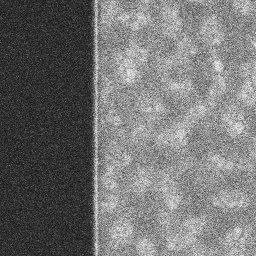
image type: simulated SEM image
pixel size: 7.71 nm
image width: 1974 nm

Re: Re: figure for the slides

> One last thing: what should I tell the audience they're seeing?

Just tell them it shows one or a few lines or trenches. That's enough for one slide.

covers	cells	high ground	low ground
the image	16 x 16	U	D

UUUUUUDDDDDDDDDD
UUUUUUDDDDDDDDDD
UUUUUUDDDDDDDDDD
UUUUUUDDDDDDDDDD
UUUUUUDDDDDDDDDD
UUUUUUDDDDDDDDDD
UUUUUUDDDDDDDDDD
UUUUUUDDDDDDDDDD
UUUUUUDDDDDDDDDD
UUUUUUDDDDDDDDDD
UUUUUUDDDDDDDDDD
UUUUUUDDDDDDDDDD
UUUUUUDDDDDDDDDD
UUUUUUDDDDDDDDDD
UUUUUUDDDDDDDDDD
UUUUUUDDDDDDDDDD